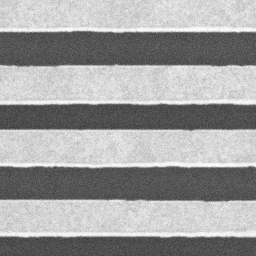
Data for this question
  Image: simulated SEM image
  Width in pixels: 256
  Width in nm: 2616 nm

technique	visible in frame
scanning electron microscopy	lines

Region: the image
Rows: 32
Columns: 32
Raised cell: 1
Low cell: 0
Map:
11111111111111111111111111111111
11111111111111111111111111111111
11111111111111111111111111111111
11111111111111111111111111111111
00000000000000000000000000000000
00000000000000000000000000000000
00000000000000000000000000000000
00000000000000000000000000000000
11111111111111111111111111111111
11111111111111111111111111111111
11111111111111111111111111111111
11111111111111111111111111111111
11111111111111111111111111111111
00000000000000000000000000000000
00000000000000000000000000000000
00000000000000000000000000000000
11111111111111111111111111111111
11111111111111111111111111111111
11111111111111111111111111111111
11111111111111111111111111111111
11111111111111111111111111111111
00000000000000000000000000000000
00000000000000000000000000000000
00000000000000000000000000000000
00000000000000000000000000000000
11111111111111111111111111111111
11111111111111111111111111111111
11111111111111111111111111111111
11111111111111111111111111111111
00000000000000000000000000000000
00000000000000000000000000000000
00000000000000000000000000000000